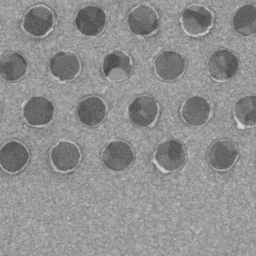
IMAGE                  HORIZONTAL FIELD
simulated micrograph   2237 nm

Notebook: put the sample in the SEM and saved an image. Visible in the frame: a regular array of raised bodies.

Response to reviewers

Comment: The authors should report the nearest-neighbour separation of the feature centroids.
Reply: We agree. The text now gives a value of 452 nm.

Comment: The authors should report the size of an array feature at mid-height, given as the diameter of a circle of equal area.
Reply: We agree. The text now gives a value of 278 nanometres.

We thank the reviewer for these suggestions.